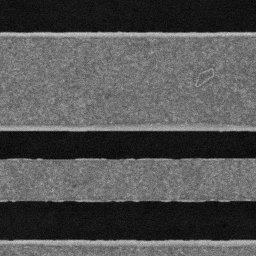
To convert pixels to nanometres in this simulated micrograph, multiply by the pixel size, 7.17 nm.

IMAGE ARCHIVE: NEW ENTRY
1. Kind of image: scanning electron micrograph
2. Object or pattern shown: lines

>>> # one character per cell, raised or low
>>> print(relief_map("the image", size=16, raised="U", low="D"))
DDDDDDDDDDDDDDDD
DDDDDDDDDDDDDDDD
UUUUUUUUUUUUUUUU
UUUUUUUUUUUUUUUU
UUUUUUUUUUUUUUUU
UUUUUUUUUUUUUUUU
UUUUUUUUUUUUUUUU
UUUUUUUUUUUUUUUU
DDDDDDDDDDDDDDDD
DDDDDDDDDDDDDDDD
UUUUUUUUUUUUUUUU
UUUUUUUUUUUUUUUU
UUUUUUUUUUUUUUUU
DDDDDDDDDDDDDDDD
DDDDDDDDDDDDDDDD
UUUUUUUUUUUUUUUU